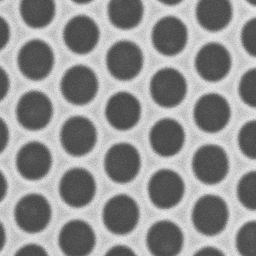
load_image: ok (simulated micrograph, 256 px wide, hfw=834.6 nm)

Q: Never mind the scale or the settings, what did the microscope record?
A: a regular array of holes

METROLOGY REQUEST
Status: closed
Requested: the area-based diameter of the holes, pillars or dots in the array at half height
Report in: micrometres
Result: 0.126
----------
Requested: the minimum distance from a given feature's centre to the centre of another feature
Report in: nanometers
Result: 165